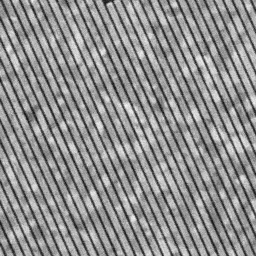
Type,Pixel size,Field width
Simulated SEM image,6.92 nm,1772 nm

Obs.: parallel lines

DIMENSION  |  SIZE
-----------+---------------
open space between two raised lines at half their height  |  0.0189 microns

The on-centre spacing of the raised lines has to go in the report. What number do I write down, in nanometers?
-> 58.3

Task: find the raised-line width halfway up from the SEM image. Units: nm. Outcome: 37.8